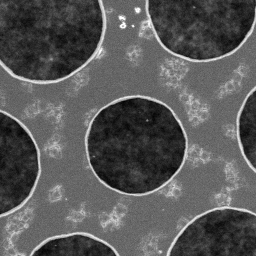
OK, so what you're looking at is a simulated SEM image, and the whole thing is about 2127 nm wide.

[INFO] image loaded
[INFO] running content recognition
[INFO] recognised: holes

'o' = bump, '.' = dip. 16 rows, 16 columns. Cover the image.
......ooo.......
......oooo......
......oooo.....o
......ooooo...oo
o....ooooooooooo
oooooooooooooooo
ooooooo...ooooo.
.ooooo.....oooo.
..ooo.......ooo.
..ooo.......ooo.
..oooo.....ooooo
..ooooo...oooooo
..oooooooooooooo
ooooooooooooo...
ooooooooooo.....
oo.....oooo.....